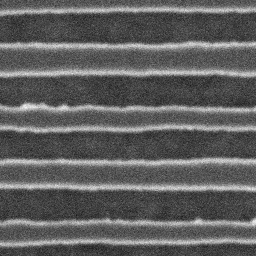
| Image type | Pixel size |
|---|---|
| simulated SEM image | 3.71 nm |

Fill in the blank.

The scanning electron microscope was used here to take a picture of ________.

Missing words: lines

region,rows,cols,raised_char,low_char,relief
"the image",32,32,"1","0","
11111111111111111111111111111111
11111100000000000000000000000000
00000000000000000000000000000000
00000000000000000000000000000000
00000000000000000000000000000000
00000000000000000000000111001111
11111111111111111111111111111111
11111111111111111111111111111111
11111111111111111111111111111111
00000000000000000000000000000000
00000000000000000000000000000000
00000000000000000000000000000000
00000000000000000000000000000000
11111111111111111111111111110000
11111111111111111111111111111111
11111111111111111111111111111111
00000000000000000000000000000000
00000000000000000000000000000000
00000000000000000000000000000000
00000000000000000000000000000000
11111111111111111111111111111111
11111111111111111111111111111111
11111111111111111111111111111111
00000000011111111111111111111111
00000000000000000000000000000000
00000000000000000000000000000000
00000000000000000000000000000000
00000000000000000000000000000000
11111111111111111111111111111111
11111111111111111111111111111111
11111000000000000000000000000000
00000000000000000000000000000000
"